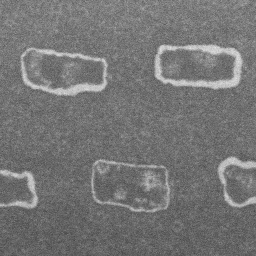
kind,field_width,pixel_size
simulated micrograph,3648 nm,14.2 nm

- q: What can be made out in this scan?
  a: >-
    raised bodies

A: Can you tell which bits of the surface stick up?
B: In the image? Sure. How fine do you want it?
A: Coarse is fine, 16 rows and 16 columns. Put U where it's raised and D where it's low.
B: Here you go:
DDDDDDDDDDDDDDDD
DDDDDDDDDDDDDDDD
DDDDDDDDDDDDDDDD
DUUUUDDDDDUUUUUD
DUUUUUUDDDUUUUUD
DDUUUUDDDDDDDDDD
DDDDDDDDDDDDDDDD
DDDDDDDDDDDDDDDD
DDDDDDDDDDDDDDDD
DDDDDDDDDDDDDDDD
DDDDDDDDDDDDDDUU
UUDDDDDDDDDDDDUU
UUDDDDDDDDDDDDUU
DDDDDDDDDDDDDDDD
DDDDDDDDDDDDDDDD
DDDDDDDDDDDDDDDD